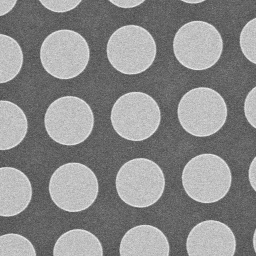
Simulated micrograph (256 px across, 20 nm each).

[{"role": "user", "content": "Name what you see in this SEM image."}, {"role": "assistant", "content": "an array of small figures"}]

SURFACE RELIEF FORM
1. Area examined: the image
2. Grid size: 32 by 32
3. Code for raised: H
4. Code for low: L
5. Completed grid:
HHLLLHHHHHLLLLHHHLLLLLLLLLLLLLLL
HLLLLLLLLLLLLLLLLLLLLLLLLLLLLLLL
LLLLLLLLLLLLLLLLLLLLLLLLLLLLLLLL
LLLLLLLLLLLLLLLHHHLLLLLHHHHLLLHH
HLLLLLHHHHLLLLHHHHHLLLHHHHHLLLHH
HHLLLHHHHHHLLHHHHHHLLLHHHHHHLLHH
HHHLLHHHHHHLLHHHHHHLLLHHHHHHLLHH
HHHLLHHHHHHLLLHHHHHLLLHHHHHLLLLH
HHHLLLHHHHHLLLHHHHLLLLLLHHLLLLLL
HHLLLLLHHHLLLLLLLLLLLLLLLLLLLLLL
LLLLLLLLLLLLLLLLLLLLLLLLLLLLLLLL
LLLLLLLLLLLLLLLLLLLLLLLLHHHLLLLH
LLLLLLLHHHLLLLLHHHHLLLLHHHHHLLLH
HHLLLLHHHHHLLLHHHHHHLLHHHHHHLLLH
HHHLLLHHHHHHLLHHHHHHLLHHHHHHLLLH
HHHLLLHHHHHHLLHHHHHHLLLHHHHHLLLH
HHHLLLHHHHHLLLLHHHHLLLLHHHHLLLLL
HHHLLLLHHHHLLLLLHHLLLLLLLLLLLLLL
HLLLLLLLLLLLLLLLLLLLLLLLLLLLLLLL
LLLLLLLLLLLLLLLLLLLLLLLLLHHLLLLL
LLLLLLLLHHLLLLLLHHHLLLLHHHHHLLLH
HHHLLLLHHHHHLLLHHHHHLLLHHHHHHLLH
HHHHLLHHHHHHLLLHHHHHHLLHHHHHHLLH
HHHHLLHHHHHHLLLHHHHHLLLHHHHHHLLL
HHHHLLHHHHHHLLLHHHHHLLLLHHHHLLLL
HHHLLLLHHHHLLLLLHHHLLLLLLLLLLLLL
HHLLLLLLLLLLLLLLLLLLLLLLLLLLLLLL
LLLLLLLLLLLLLLLLLLLLLLLLLLLLLLLL
LLLLLLLLLLLLLLLLLHHLLLLLHHHHHLLL
HHHLLLLLHHHHLLLLHHHHHLLLHHHHHLLL
HHHHLLLHHHHHLLLHHHHHHLLHHHHHHLLL
HHHHLLLHHHHHHLLHHHHHHLLHHHHHHLLL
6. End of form